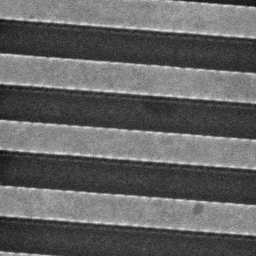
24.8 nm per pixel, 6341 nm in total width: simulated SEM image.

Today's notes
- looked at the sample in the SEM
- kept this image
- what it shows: lines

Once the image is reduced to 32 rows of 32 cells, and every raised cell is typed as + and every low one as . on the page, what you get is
++++++++++++++++++++++++++......
++++++++++++++++++++++++++++++++
...+++++++++++++++++++++++++++++
...............+++++++++++++++++
.............................+++
................................
................................
+++++++++.......................
+++++++++++++++++++++++.........
++++++++++++++++++++++++++++++++
..++++++++++++++++++++++++++++++
..............++++++++++++++++++
............................++++
................................
................................
++++++..........................
++++++++++++++++++++............
+++++++++++++++++++++++++++++++.
++++++++++++++++++++++++++++++++
...........+++++++++++++++++++++
.......................+++++++++
................................
................................
+++.............................
++++++++++++++++................
++++++++++++++++++++++++++++++..
++++++++++++++++++++++++++++++++
........++++++++++++++++++++++++
....................++++++++++++
................................
................................
+...............................